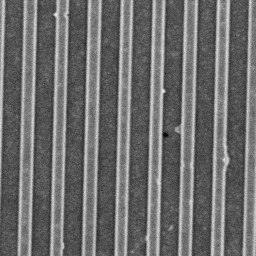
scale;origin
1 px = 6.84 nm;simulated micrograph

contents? parallel lines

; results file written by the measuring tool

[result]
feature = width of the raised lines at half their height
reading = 79.5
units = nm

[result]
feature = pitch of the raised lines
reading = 220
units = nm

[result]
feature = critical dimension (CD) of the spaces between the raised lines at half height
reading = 138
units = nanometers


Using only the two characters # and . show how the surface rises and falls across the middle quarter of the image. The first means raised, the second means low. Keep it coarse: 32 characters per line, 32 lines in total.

#.....###.....##......###.....##
#.....###.....##......###.....##
#.....###.....##......###.....##
#.....###.....##......###.....##
......###.....##......###.....##
......###.....##......###.....##
......###.....##......###.....##
......###.....##......##......##
......###.....##......##......##
......###.....##......##......##
......###.....##......##......##
......###.....##......##......##
......##......##......##......##
......##......##......##......##
......##......##......##......##
......##......##......##......##
.....###......##......##......##
.....###......##......##......##
.....###......##......##......##
.....###......##......##.....###
.....###......##......##.....###
.....###......##.....###.....###
.....###......##.....###.....###
.....###......##.....###.....###
.....###.....###.....###.....###
.....###.....###.....###.....###
.....###.....###.....###.....###
.....###.....###.....###.....###
.....###.....###.....###.....###
.....###.....###.....###.....###
.....###.....###.....###.....###
.....###.....###.....###.....###